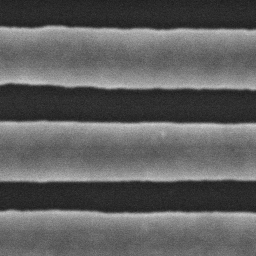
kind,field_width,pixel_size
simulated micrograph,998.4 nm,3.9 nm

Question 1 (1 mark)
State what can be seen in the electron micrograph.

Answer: lines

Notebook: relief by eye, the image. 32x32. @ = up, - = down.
--------------------------------
--------------------------------
--------------------------------
@@---@@@@-----------------------
@@@@@@@@@@@@@@@@@@@@@@@@@@@@@@@@
@@@@@@@@@@@@@@@@@@@@@@@@@@@@@@@@
@@@@@@@@@@@@@@@@@@@@@@@@@@@@@@@@
@@@@@@@@@@@@@@@@@@@@@@@@@@@@@@@@
@@@@@@@@@@@@@@@@@@@@@@@@@@@@@@@@
@@@@@@@@@@@@@@@@@@@@@@@@@@@@@@@@
@--@@@@@@@@@@@@@@@@@@@@@@@@@@@@@
--------------------------------
--------------------------------
--------------------------------
--------------------------------
@@@@@@@@@@@@@@@@@@@@@@@@@@@--@@@
@@@@@@@@@@@@@@@@@@@@@@@@@@@@@@@@
@@@@@@@@@@@@@@@@@@@@@@@@@@@@@@@@
@@@@@@@@@@@@@@@@@@@@@@@@@@@@@@@@
@@@@@@@@@@@@@@@@@@@@@@@@@@@@@@@@
@@@@@@@@@@@@@@@@@@@@@@@@@@@@@@@@
@@@@@@@@@@@@@@@@@@@@@@@@@@@@@@@@
@@@@@@@@@@@@@@@@@@@@@@----------
--------------------------------
--------------------------------
--------------------------------
@@@@@@@@@@@@@-------@@@--@@@----
@@@@@@@@@@@@@@@@@@@@@@@@@@@@@@@@
@@@@@@@@@@@@@@@@@@@@@@@@@@@@@@@@
@@@@@@@@@@@@@@@@@@@@@@@@@@@@@@@@
@@@@@@@@@@@@@@@@@@@@@@@@@@@@@@@@
@@@@@@@@@@@@@@@@@@@@@@@@@@@@@@@@